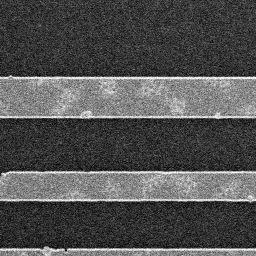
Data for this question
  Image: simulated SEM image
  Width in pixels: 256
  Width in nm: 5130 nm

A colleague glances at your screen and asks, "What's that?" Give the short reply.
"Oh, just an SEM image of one or a few lines or trenches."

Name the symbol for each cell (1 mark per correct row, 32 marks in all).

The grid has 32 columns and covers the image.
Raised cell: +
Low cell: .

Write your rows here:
................................
................................
................................
................................
................................
................................
................................
................................
................................
................................
++++++++++++++++++++++++++++++++
++++++++++++++++++++++++++++++++
++++++++++++++++++++++++++++++++
++++++++++++++++++++++++++++++++
++++++++++++++++++++++++++++++++
................................
................................
................................
................................
................................
................................
................................
++++++++++++++++++++++++++++++++
++++++++++++++++++++++++++++++++
++++++++++++++++++++++++++++++++
................................
................................
................................
................................
................................
................................
++++++++++++++++++++++++++++++++